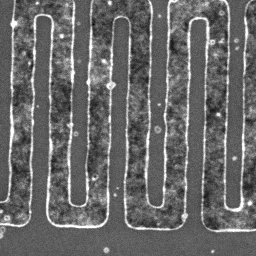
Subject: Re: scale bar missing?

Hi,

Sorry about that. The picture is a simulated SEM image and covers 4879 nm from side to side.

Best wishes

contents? groups of lines, slits or small figures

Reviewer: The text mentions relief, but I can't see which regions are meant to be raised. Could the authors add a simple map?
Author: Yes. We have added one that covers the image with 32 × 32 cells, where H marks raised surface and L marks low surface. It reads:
LLHHHHHHHLLHHHHHHHHLLHHHHHHHLLLH
LLHHHHHHHLLHHHHHHHHLLHHHHHHHHLLH
LLHHLLHHHLLHHHLLHHHLLHHHLLHHHLLH
LLHHLLLHHLLHHHLLHHHLLHHHLLHHHLLH
LLHHLLLHHLLHHHLLHHHLLHHHLLHHHLLH
LLHHLLLHHLLHHHLLHHHLLHHHLLHHLLLH
LLHHLLHHHLLHHHLLHHHLLHHHLLHHHLLH
LLHHLLHHHLLHHHLLHHHLLHHHLLHHHLLH
LLHHLLHHHLLHHHLLHHHLLHHHLLHHLLLH
LLHHLLHHHLLHHHLLHHHLLHHHLLHHLLLH
LLHHLLHHHLLHHHLLHHHLLHHHLLHHLLLH
LLHHLLHHHLLHHHLLHHHLLHHHLLHHLLLH
LLHHLLHHHLLHHHLLHHHLLHHHLLHHLLLH
LHHHLLHHHLLHHHLLHHHLLHHHLLHHLLLH
LHHHLLHHHLLHHHLLHHHLLHHHLLHHLLLH
LLHHLLHHHLLHHHLLHHHLLHHLLLHHLLLH
LLHHLLHHHLLHHHLLHHHLLHHLLLHHLLHH
LHHHLLHHHLLHHHLLHHHLLHHLLLHHLLHH
LHHHLLHHHLLHHHLLHHLLLHHLLLHHLLHH
LHHHLLHHHLLHHHLLHHLLLHHLLLHHLLHH
LHHHLLHHHLLHHHLLHHLLLHHLLHHHLLHH
LHHHLLHHHLLHHHLLHHLLLHHLLHHHLLHH
LHHHLLHHHLLHHHLLHHLLLHHLLHHHLLHH
LHHHLLHHHLLHHHLLHHLLLHHLLHHHLLHH
LHHHLLHHHLLHHHLLHHLLHHHLLHHHLLHH
HHHHLLHHHLLHHHLLHHHLHHHLLHHHLLHH
HHHHLLHHHHHHHHLLHHHHHHHLLHHHHHHH
HHHHLLHHHHHHHLLLHHHHHHHLLHHHHHHH
LLLLLLLLLLLLLLLLLHHHHHLLLLHHHHHH
LLLLLLLLLLLLLLLLLLLLLLLLLLLLLLLL
LLLLLLLLLLLLLLLLLLLLLLLLLLLLLLLL
LLLLLLLLLLLLLLLLLLLLLLLLLLLLLLLL